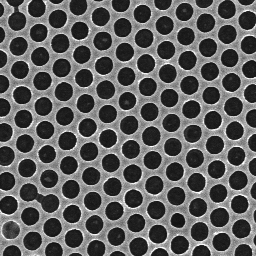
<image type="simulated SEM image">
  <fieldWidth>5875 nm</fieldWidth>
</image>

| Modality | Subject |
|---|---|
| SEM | a regular array of holes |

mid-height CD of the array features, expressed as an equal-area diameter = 429 nanometres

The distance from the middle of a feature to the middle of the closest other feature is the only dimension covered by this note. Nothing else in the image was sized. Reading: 547 nm